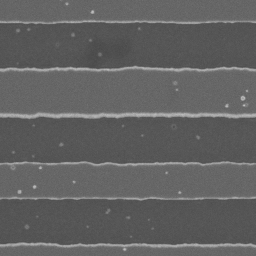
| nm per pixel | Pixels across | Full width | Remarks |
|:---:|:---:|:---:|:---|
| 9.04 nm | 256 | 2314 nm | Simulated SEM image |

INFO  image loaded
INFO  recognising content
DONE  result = lines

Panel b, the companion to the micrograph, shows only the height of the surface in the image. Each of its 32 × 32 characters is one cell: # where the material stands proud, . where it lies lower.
################################
################################
################################
................................
................................
................................
................................
................................
.......##......####........###..
################################
################################
################################
################################
################################
################.########.######
................................
................................
................................
................................
................................
###############.################
################################
################################
################################
################################
................................
................................
................................
................................
................................
.######.....##..###....##..####.
################################